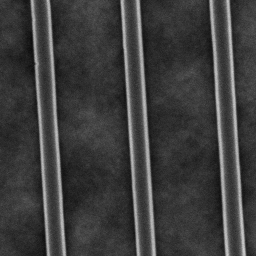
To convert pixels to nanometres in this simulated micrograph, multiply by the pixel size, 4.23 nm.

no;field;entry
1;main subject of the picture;one or a few lines or trenches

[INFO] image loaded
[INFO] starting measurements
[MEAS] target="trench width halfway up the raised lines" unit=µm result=0.305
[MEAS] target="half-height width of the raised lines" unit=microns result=0.0728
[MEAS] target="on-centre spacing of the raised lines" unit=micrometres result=0.378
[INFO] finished